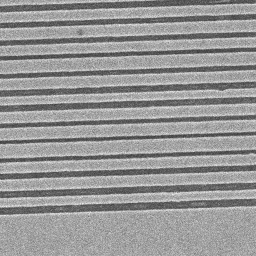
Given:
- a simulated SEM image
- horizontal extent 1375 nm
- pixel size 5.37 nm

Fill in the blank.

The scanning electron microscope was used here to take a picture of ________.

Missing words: parallel lines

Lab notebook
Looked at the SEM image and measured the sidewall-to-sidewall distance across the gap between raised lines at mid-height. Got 28.8 nanometres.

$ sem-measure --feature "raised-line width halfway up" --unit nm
62.3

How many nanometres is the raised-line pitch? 90.3